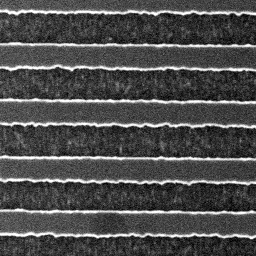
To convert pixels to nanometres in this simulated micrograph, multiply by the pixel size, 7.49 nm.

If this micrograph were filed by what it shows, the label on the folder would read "lines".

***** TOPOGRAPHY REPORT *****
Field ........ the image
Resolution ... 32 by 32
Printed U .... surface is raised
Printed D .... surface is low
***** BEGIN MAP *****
UUUUUUUUUUUUUUUUUUUUUUUUUUUUUUUU
DUUDUUUUUUUUUUUUUUUUUUUUUUUUUUUU
DDDDDDDDDDDDDDDDDDDDDDDDDDDDDDDD
DDDDDDDDDDDDDDDDDDDDDDDDDDDDDDDD
DDDDDDDDDDDDDDDDDDDDDDDDDDDDDDDD
DUUDDDDDDDDDDDDDDDDDDDDDDDDDDDDD
UUUUUUUUUUUUUUUUUUUUUUUUUUUUUUUU
UUUUUUUUUUUUUUUUUUUUUUUUUUUUUUUU
UUUUUUUDUUDUDUUUUUUUUUUUUUUUUUUU
DDDDDDDDDDDDDDDDDDDDDDDDDDDDDDDD
DDDDDDDDDDDDDDDDDDDDDDDDDDDDDDDD
DDDDDDDDDDDDDDDDDDDDDDDDDDDDDDDD
UUDDUDDDDDDDDDDDDDDDDDDDDDDDDDDD
UUUUUUUUUUUUUUUUUUUUUUUUUUUUUUUU
UUUUUUUUUUUUUUUUUUUUUUUUUUUUUUUU
UUUUUUUUUUUUUUUUUUUUUUUUUUUUUUUU
DDDDDDDDDDDDDDDDDDDDDDDDDDDDDDDD
DDDDDDDDDDDDDDDDDDDDDDDDDDDDDDDD
DDDDDDDDDDDDDDDDDDDDDDDDDDDDDDDD
DDDDDDDDDDDDDDDDDDDDDDDDDDDDDDDD
UUUUUUUUUUUUUUUUUUUUUUUUUUUUUUUU
UUUUUUUUUUUUUUUUUUUUUUUUUUUUUUUU
UUUUUUUUUUUUUUUUUUUUUUUUUUUUUUUU
DDDDDDDDDDDDDDDDDDDDDDDDDDDDDDDD
DDDDDDDDDDDDDDDDDDDDDDDDDDDDDDDD
DDDDDDDDDDDDDDDDDDDDDDDDDDDDDDDD
UUUUUUUUUUUUUUUUUUUUUUUDDDDDUDDU
UUUUUUUUUUUUUUUUUUUUUUUUUUUUUUUU
UUUUUUUUUUUUUUUUUUUUUUUUUUUUUUUU
DDDDDDDDDUDDUUDDDUDDDUUDDDDUUDUU
DDDDDDDDDDDDDDDDDDDDDDDDDDDDDDDD
DDDDDDDDDDDDDDDDDDDDDDDDDDDDDDDD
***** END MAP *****